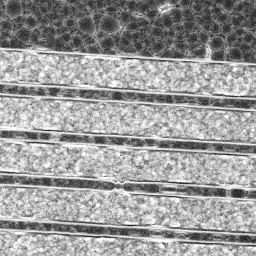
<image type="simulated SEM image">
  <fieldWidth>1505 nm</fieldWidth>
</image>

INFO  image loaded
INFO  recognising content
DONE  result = parallel lines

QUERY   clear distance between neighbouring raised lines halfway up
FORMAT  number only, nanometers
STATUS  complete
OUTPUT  202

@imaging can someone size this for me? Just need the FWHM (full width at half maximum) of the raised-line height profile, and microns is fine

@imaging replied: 0.0639